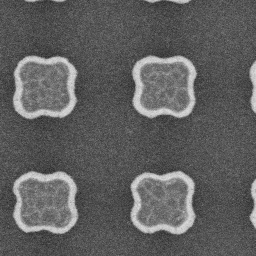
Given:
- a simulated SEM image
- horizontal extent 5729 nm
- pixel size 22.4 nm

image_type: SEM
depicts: raised bodies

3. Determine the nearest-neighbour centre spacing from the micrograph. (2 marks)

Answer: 2590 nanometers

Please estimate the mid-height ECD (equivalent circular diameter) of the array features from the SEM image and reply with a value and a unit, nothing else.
1350 nm